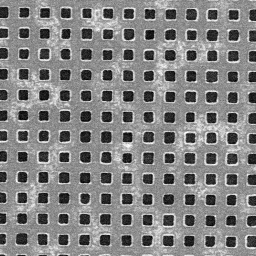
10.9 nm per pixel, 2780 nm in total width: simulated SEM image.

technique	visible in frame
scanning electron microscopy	a regular array of holes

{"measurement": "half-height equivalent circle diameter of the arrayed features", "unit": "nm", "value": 130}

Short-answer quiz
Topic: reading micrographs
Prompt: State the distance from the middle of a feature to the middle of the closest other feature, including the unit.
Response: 221 nanometers